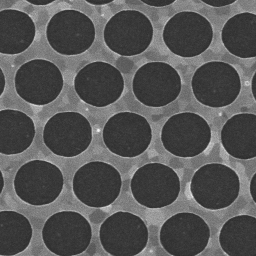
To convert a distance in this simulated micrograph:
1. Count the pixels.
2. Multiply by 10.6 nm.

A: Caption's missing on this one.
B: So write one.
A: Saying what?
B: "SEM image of a regular array of holes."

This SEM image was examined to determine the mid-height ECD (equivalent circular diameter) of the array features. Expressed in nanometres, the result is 501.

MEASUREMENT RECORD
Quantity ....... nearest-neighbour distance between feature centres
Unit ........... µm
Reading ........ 0.611